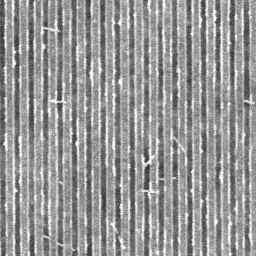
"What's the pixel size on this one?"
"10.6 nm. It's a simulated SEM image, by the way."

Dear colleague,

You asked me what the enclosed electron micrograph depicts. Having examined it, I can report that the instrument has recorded parallel lines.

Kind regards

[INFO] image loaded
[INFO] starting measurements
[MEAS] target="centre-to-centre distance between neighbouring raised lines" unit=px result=14.4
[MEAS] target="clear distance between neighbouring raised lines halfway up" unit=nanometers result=71.3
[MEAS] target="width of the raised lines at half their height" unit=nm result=81.9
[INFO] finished